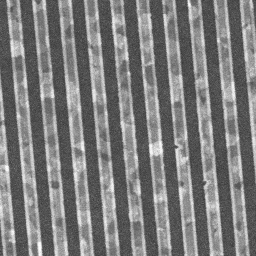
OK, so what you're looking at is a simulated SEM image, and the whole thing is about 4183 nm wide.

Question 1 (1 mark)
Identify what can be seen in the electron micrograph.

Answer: parallel lines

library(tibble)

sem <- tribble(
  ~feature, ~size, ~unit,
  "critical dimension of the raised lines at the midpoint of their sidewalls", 165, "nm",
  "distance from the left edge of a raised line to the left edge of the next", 421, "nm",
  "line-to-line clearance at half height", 254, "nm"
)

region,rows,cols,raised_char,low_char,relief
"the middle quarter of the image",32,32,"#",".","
###....##....###....##....###...
.##....##....###....##....###...
.##....##.....##....###...###...
.##....###....##....###....##...
.##....###....##....###....##...
.##....###....##....###....##...
.##....###....##....###....##...
.##.....##....###...###....##...
.###....##....###....##....###..
.###....##....###....##....###..
.###....##....###....##....###..
.###....##....###....##....###..
..##....##....###....##....###..
..##....##.....##....###...###..
..##....##.....##....###...###..
..##....###....##....###....##..
..##....###....##....###....##..
..##....###....##....###....##..
..##.....##....###...###....##..
..##.....##....###...###....###.
..###....##....###....##.....##.
..###....##....###....##....###.
..###....##....###....##....###.
..###....##....###....##....###.
...##....##....###....###...###.
...##....##.....##....###...###.
...##....###....##....###....##.
...##....###....##....###....##.
...##....###....##....###....##.
...##....###....###...###....##.
...##.....##....###....##....##.
...###....##....###....##....###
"